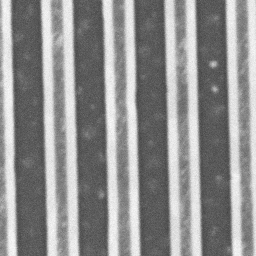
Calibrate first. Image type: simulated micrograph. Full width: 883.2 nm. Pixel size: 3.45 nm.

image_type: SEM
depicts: one or a few lines or trenches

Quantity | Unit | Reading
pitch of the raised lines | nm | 212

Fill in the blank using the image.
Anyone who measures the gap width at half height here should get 138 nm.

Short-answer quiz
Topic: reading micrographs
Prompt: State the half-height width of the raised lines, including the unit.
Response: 76.3 nm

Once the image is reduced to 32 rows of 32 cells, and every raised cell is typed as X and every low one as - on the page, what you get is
X-----XX-----XXX-----XXX-----XXX
X-----XX------XX-----XXX-----XXX
X-----XX------XX-----XXX-----XXX
X-----XX------XX-----XXX-----XXX
X-----XX------XX-----XXX-----XXX
X-----XXX-----XX-----XXX-----XXX
X-----XXX-----XX-----XXX-----XXX
X-----XXX-----XX-----XXX-----XXX
X-----XXX-----XX-----XXX-----XXX
X-----XXX-----XX-----XXX-----XXX
X-----XXX-----XX-----XXX-----XXX
X-----XXX-----XX------XX-----XXX
X-----XXX-----XX------XX-----XXX
X-----XXX-----XX------XX-----XXX
X-----XXX-----XX------XX-----XXX
X-----XXX-----XXX-----XX-----XXX
X-----XXX-----XXX-----XX-----XXX
X-----XXX-----XXX-----XX-----XXX
X-----XXX-----XXX-----XX-----XXX
X-----XXX-----XXX-----XX-----XXX
X-----XXX-----XXX-----XX-----XXX
X-----XXX-----XXX-----XX-----XXX
X-----XXX-----XXX-----XX-----XXX
X-----XXX-----XXX-----XX-----XXX
X-----XXX-----XXX-----XX-----XXX
X-----XXX-----XXX-----XX-----XXX
X-----XXX-----XXX-----XX------XX
X------XX-----XXX-----XX------XX
X------XX-----XXX-----XX------XX
X------XX-----XXX-----XXX-----XX
X------XX-----XXX-----XXX-----XX
XX-----XX-----XXX-----XXX-----XX